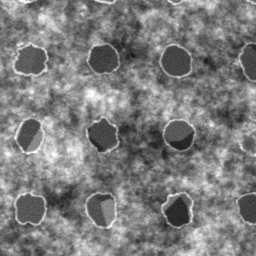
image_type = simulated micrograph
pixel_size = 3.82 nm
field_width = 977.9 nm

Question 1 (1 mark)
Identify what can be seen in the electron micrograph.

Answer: a regular array of raised bodies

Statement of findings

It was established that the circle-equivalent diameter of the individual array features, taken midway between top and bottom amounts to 32.1 px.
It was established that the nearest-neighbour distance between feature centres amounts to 278 nm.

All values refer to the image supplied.